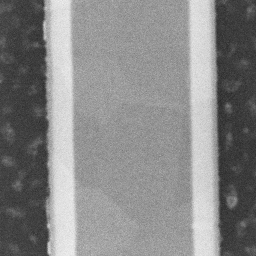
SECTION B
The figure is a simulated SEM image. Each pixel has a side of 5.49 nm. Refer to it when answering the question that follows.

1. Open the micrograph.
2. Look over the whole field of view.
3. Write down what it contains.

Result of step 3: one or a few lines or trenches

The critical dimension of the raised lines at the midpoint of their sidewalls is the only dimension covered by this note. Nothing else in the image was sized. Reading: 755 nanometres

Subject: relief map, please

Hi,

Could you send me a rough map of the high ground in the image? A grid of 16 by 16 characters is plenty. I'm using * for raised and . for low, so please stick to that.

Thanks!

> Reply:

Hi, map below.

....********....
....********....
....********....
....********....
....********....
....*********...
....*********...
....*********...
....*********...
....*********...
....*********...
....*********...
....*********...
....*********...
....*********...
....*********...